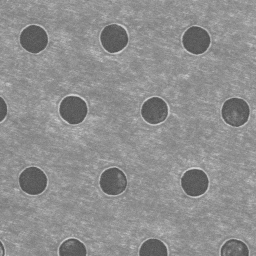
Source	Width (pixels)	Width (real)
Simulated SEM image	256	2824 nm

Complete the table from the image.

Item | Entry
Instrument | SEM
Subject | a regular array of holes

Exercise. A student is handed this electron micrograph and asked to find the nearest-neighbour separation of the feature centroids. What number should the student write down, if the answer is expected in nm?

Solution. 890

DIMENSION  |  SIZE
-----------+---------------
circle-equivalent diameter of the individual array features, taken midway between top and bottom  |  317 nanometres